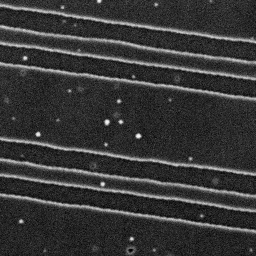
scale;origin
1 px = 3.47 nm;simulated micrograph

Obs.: lines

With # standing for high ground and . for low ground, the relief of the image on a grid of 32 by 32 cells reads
################################
.....###########################
............####################
##.................#############
#########.................######
#################...............
........###############.........
...............###############..
#####.................##########
#############................###
####################............
###########################.....
################################
################################
################################
################################
################################
################################
.......#########################
..............##################
####.................###########
###########..................###
...################.............
...........##############.......
##................##############
########.................#######
################................
#######################.........
#############################...
################################
################################
################################